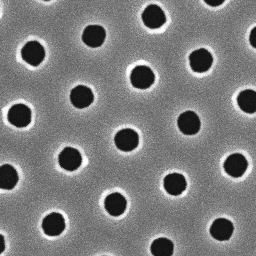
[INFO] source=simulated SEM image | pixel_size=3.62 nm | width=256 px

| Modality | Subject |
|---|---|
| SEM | a regular array of holes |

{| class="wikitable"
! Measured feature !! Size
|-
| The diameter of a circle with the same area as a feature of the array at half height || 87.3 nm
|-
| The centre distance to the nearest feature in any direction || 226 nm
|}